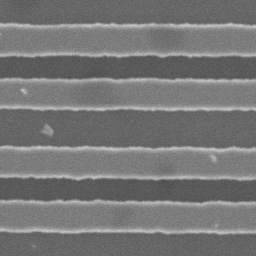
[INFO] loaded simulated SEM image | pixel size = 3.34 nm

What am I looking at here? lines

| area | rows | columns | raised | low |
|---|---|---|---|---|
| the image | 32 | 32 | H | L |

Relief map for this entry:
LLLLLLLLLLLLLLLLLLLLLLLLLLLLLLLL
LLLLLLLLLLLLLLLLLLLLLLLLLLLLLLLL
LLLLLLLLLLLLLLLLLLLLLLLLLLLLLLLL
HHHHHHHHHHHHHHHHHHHHHHHHHHHHHHHH
HHHHHHHHHHHHHHHHHHHHHHHHHHHHHHHH
HHHHHHHHHHHHHHHHHHHHHHHHHHHHHHHH
HHHHHHHHHHHHHHHHHHHHHHHHHHHHHHHH
LLLLLLLLLLLLLLLLLLLLLLLLLLLLLLLL
LLLLLLLLLLLLLLLLLLLLLLLLLLLLLLLL
LLLLLLLLLLLLLLLLLLLLLLLLLLLLLLLL
HHHHHHHHHHHHHHHHHHHHHHHHHHHHHHHH
HHHHHHHHHHHHHHHHHHHHHHHHHHHHHHHH
HHHHHHHHHHHHHHHHHHHHHHHHHHHHHHHH
HHHHHHHHHHHHHHHHHHHHHHHHHHHHHHHH
LLLLLLLLLLLLLLLLLLLLLLLLLLLLLLLL
LLLLLLLLLLLLLLLLLLLLLLLLLLLLLLLL
LLLLLLLLLLLLLLLLLLLLLLLLLLLLLLLL
LLLLLLLLLLLLLLLLLLLLLLLLLLLLLLLL
HHHHHHHHHHHHHHLLHHLLLHHHLLLLLHLL
HHHHHHHHHHHHHHHHHHHHHHHHHHHHHHHH
HHHHHHHHHHHHHHHHHHHHHHHHHHHHHHHH
HHHHHHHHHHHHHHHHHHHHHHHHHHHHHHHH
LLLLLLLLLLLLLLLLLLLLLLLLLLLLLLLL
LLLLLLLLLLLLLLLLLLLLLLLLLLLLLLLL
LLLLLLLLLLLLLLLLLLLLLLLLLLLLLLLL
HHHHHHHHHHHHHHHHHHHHHHHHHHHHHHHH
HHHHHHHHHHHHHHHHHHHHHHHHHHHHHHHH
HHHHHHHHHHHHHHHHHHHHHHHHHHHHHHHH
HHHHHHHHHHHHHHHHHHHHHHHHHHHHHHHH
LLLLLLLLLLLLLLLLLLLLLLLLLLLLLLLL
LLLLLLLLLLLLLLLLLLLLLLLLLLLLLLLL
LLLLLLLLLLLLLLLLLLLLLLLLLLLLLLLL